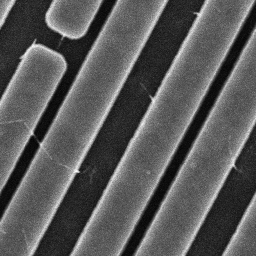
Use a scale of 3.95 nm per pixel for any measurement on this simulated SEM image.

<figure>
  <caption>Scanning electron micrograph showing one or a few lines or trenches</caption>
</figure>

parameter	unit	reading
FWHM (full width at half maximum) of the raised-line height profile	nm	174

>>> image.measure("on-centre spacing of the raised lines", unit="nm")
263